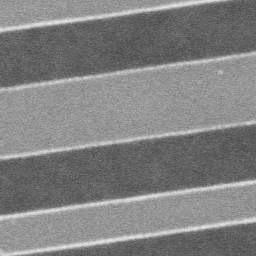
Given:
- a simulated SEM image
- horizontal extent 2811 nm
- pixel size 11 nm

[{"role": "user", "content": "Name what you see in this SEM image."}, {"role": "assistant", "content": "lines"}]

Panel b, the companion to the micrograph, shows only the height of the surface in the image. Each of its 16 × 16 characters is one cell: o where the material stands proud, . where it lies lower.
oooooooooo......
ooo.............
................
..............oo
........oooooooo
.ooooooooooooooo
oooooooooooooooo
oooooooooooooooo
oooooooooo......
ooo.............
................
...............o
........oooooooo
oooooooooooooooo
ooooooooooo.....
oooo............